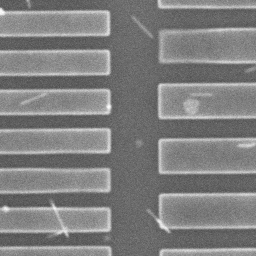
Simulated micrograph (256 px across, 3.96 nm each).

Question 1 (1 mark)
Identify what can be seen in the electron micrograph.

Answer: groups of lines, slits or small figures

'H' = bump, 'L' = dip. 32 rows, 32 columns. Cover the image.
LLLLLLLLLLLLLLLLLLLLHHHHHHHHHHHH
HLLHHHHHHHHHHLLLLLLLLLLLLLLLLLLL
HHHHHHHHHHHHHHLLLLLLLLLLLLLLLLLL
HHHHHHHHHHHHHHLLLLLLLLLLLLLLLLLL
LLLLLLLLLLLLLLLLLLLLHHHHHHHHHHHH
LLLLLLLLLLLLLLLLLLLLHHHHHHHHHHHH
HHHHHHHHHHHHHLLLLLLLHHHHHHHHHHHH
HHHHHHHHHHHHHHLLLLLLHHHHHHHHHHHH
HHHHHHHHHHHHHHLLLLLLLLLLLLLLLLLL
LLLLLLLLLLLLLLLLLLLLLLLLLLLLLLLL
LLLLLLLLLLLLLLLLLLLLLLLLLLHHHHHH
HHHHHHHHHHHHHHLLLLLLHHHHHHHHHHHH
HHHHHHHHHHHHHHLLLLLLHHHHHHHHHHHH
HHHHHHHHHHHHHHLLLLLLHHHHHHHHHHHH
LLLLLLLLLLLLLLLLLLLLHHHHHHHHHHHH
LLLLLLLLLLLLLLLLLLLLLLLLLLLLLLLL
HHHHHHHHHHHHHHLLLLLLLLLLLLLLLLLL
HHHHHHHHHHHHHHLLLLLLHHHHHHHHHHHH
HHHHHHHHHHHHHHLLLLLLHHHHHHHHHHHH
LLLLLLLLLLLLLLLLLLLLHHHHHHHHHHHH
LLLLLLLLLLLLLLLLLLLLHHHHHHHHHHHH
HHHHHHHHHHHHHHLLLLLLHHHHHHHHHHHH
HHHHHHHHHHHHHHLLLLLLLLLLLLLLLLLL
HHHHHHHHHHHHHHLLLLLLLLLLLLLLLLLL
LLLLLLLLLLLLLLLLLLLLHHHHHHHHHHHH
LLLLLLLLLLLLLLLLLLLLHHHHHHHHHHHH
HHHHHHHHHHHHHHLLLLLLHHHHHHHHHHHH
HHHHHHHHHHHHHHLLLLLLHHHHHHHHHHHH
HHHHHHHHHHHHHHLLLLLLHHHLLLLLLLLL
LLLLLLLLLLLLLLLLLLLLLLLLLLLLLLLL
LLLLLLLLLLLLLLLLLLLLLLLLLLLLLLLL
HHHHHHHHHHHHHHLLLLLLHHHHHHHHHHHH